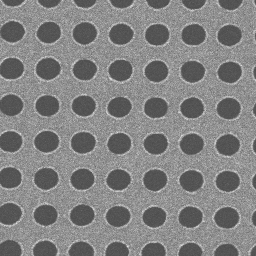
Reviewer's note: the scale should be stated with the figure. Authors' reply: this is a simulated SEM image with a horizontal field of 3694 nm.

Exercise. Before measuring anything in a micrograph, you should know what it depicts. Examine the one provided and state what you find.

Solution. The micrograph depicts a regular array of holes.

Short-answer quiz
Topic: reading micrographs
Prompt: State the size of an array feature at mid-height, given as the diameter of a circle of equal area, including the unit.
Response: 0.32 micrometres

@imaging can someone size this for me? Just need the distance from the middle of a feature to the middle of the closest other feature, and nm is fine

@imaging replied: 521